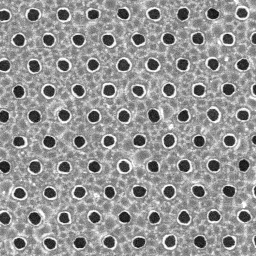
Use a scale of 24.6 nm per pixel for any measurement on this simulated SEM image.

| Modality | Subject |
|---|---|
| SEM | a regular array of holes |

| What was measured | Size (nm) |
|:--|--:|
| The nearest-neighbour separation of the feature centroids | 711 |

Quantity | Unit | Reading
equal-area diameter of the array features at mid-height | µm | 0.307